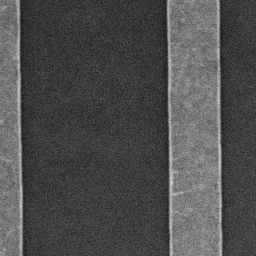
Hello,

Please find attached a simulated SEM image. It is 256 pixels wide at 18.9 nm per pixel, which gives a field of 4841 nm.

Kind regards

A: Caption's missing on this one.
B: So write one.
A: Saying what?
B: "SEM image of wiring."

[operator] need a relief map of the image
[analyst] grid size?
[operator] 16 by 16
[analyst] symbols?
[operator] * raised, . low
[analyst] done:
*..........***..
*..........***..
*..........***..
*..........***..
*..........***..
*..........***..
*..........***..
*..........***..
*..........***..
*..........***..
*..........***..
*..........***..
*..........***..
*..........***..
*..........***..
*..........***..